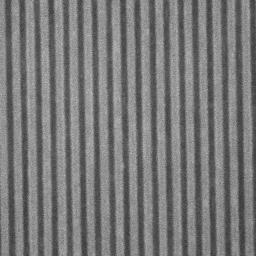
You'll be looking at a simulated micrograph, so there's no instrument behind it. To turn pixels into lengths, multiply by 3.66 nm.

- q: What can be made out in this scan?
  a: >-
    parallel lines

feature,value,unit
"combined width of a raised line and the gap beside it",52.6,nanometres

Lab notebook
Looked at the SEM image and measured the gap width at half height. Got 24.2 nanometers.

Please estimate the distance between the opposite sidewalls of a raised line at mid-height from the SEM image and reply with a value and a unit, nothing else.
27.4 nm